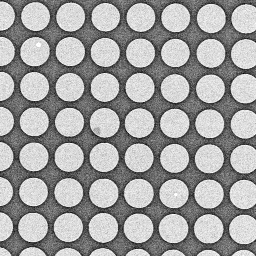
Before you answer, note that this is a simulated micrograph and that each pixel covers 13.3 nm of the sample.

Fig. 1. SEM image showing an array of small figures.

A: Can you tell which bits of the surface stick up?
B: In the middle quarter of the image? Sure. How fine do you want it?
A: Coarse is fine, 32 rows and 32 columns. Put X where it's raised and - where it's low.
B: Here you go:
----------X-------XX-------XX---
--------------------------------
-X-------XX-------XX------------
XXXX----XXXXX---XXXXXX---XXXXX--
XXXXX--XXXXXX---XXXXXX---XXXXXX-
XXXXX--XXXXXXX--XXXXXX--XXXXXXX-
XXXXX--XXXXXXX--XXXXXX--XXXXXXX-
XXXX---XXXXXX---XXXXXX---XXXXXX-
XXXX----XXXXX----XXXXX---XXXXX--
---------------------------XX---
--------------------------------
XXX-----XXXX-----XXX------XXX---
XXXX---XXXXXX---XXXXXX---XXXXX--
XXXXX--XXXXXXX--XXXXXX--XXXXXXX-
XXXXX--XXXXXXX-XXXXXXX--XXXXXXX-
XXXXX--XXXXXXX-XXXXXXX--XXXXXXX-
XXXX---XXXXXX---XXXXXX---XXXXXX-
XXX-----XXXXX---XXXXX----XXXXX--
--------------------------------
--------------------------------
XXX-----XXXX-----XXXX-----XXX---
XXXX---XXXXXX---XXXXXX---XXXXX--
XXXXX--XXXXXXX-XXXXXXX--XXXXXXX-
XXXXX--XXXXXXX-XXXXXXX--XXXXXXX-
XXXXX--XXXXXX--XXXXXXX--XXXXXXX-
XXXX---XXXXXX---XXXXXX---XXXXXX-
XXX-----XXXX-----XXXX-----XXXX--
--------------------------------
--------------------------------
XXXX----XXXX-----XXXX----XXXX---
XXXX---XXXXXX---XXXXXX---XXXXXX-
XXXXX-XXXXXXX--XXXXXXX--XXXXXXX-